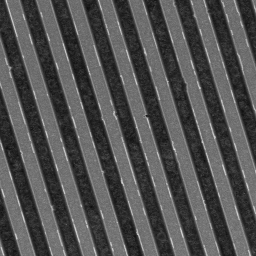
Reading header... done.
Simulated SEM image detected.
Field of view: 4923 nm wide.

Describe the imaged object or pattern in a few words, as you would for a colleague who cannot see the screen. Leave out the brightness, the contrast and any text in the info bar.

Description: parallel lines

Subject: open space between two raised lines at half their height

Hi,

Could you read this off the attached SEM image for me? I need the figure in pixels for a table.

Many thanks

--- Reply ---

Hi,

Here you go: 15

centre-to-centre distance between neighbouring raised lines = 567 nm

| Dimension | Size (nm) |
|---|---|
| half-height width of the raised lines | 285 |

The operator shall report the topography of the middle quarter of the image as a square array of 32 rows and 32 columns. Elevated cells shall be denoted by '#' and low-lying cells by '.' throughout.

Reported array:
##....###....####....####....###
##....####....###....####....###
##....####....####....###....###
###...####....####....####....##
###....####....###....####....##
###....####....####....###.....#
####...####....####....####....#
####....###....####....####....#
####....####....####...####....#
.####...####....####....###....#
.####....###....####....####....
.####....####....###....####....
..###....####....####....###....
..####....###....####....####...
..####....####....###....####...
..####....####....####....###...
...####...####....####....####..
...####....####...####....####..
...####....####....####....###..
....###....####....####....###..
....####....###....####....####.
....####....####....####...####.
#....###....####....####....###.
#....####...####....####....####
#....####....####....###....####
##....###....####....####....###
##....####....###....####....###
##....####....####...####....###
###...####....####....####....##
###....###....####....####....##
###....####....###....####....##
###....####....####....####...##